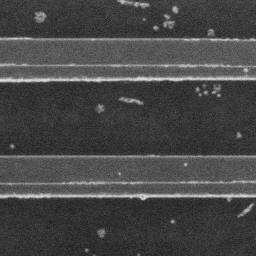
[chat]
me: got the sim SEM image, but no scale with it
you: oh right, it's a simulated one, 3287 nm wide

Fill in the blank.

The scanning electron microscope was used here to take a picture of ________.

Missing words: lines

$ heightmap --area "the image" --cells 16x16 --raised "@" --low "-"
----------------
----------------
@@@@@@@@@@@@@@@-
@@@@@@@@@@@@@@@@
@@@@@@@@@@@@@@@@
----------------
----------------
----------------
----------------
----------------
@@@@@@@@@@@@@@@@
@@@@@@@@@@@@@@@@
----------------
----------------
----------------
----------------